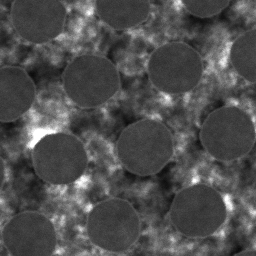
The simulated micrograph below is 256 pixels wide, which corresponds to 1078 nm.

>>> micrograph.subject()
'raised bodies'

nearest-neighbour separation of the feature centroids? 83.6 pixels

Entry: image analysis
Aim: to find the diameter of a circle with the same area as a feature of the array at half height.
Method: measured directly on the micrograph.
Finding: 234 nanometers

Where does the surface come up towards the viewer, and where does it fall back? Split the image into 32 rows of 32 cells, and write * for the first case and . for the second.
..******....*******....*****....
.*******....*******.....***.....
.*******.....*****..............
..******......**................
..*****.......................**
....*................**......***
...................******....***
.........*****.....******....***
***.....*******...*******....***
****....*******....******.....**
****....*******....******.......
****....*******.....****........
****.....*****..................
****......**................**..
***.......................*****.
................****.....*******
...............******....*******
.....*****.....*******...*******
....*******....*******....*****.
....*******....*******....****..
*....******....******...........
*...*******.....****............
*....*****......................
.......................****.....
......................******....
............****......******....
...**......******....*******....
.*****.....******....*******....
*******....*******....*****.....
*******....******......***......
*******.....*****...............
.******.......*...............**